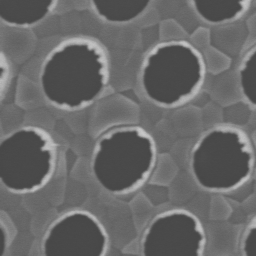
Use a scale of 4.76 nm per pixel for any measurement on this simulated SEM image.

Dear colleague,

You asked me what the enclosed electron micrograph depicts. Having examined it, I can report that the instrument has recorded holes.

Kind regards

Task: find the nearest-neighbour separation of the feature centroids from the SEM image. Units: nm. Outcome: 467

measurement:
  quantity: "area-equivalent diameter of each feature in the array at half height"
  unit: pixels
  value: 56.8